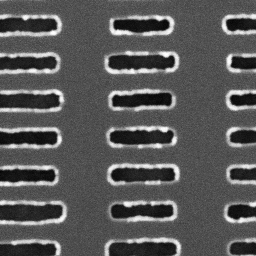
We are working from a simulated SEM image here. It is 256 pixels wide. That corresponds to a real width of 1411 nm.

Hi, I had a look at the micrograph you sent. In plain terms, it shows holes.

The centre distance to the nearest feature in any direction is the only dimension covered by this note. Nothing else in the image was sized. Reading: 0.202 um